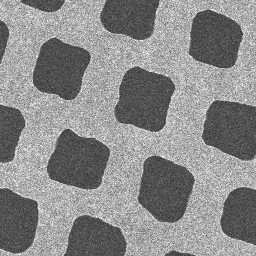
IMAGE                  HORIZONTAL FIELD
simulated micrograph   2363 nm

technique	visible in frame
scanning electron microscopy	holes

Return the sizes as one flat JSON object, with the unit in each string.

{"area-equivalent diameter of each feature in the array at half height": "543 nm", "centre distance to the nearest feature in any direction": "0.834 µm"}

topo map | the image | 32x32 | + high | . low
+++.....+++++.......++++++++++++
+++++++++++++.......+++++..+++++
+++++++++++++......+++++.....+++
.++++++++++++......+++++......++
.+++++++++++++++...+++++......++
.++++....+++++++++++++++......++
.++++......+++++++++++++......++
+++++......+++++++++++++......++
++++.......+++++..++++++++++.+++
++++......+++++......+++++++++++
++++......+++++.......++++++++++
+++++.....+++++.......++++++++++
++++++++.++++++......+++++++++++
..++++++++++++.......+++++......
...+++++++++++.......+++++......
...+++++++++++++.....+++++......
...+++++.++++++++++++++++.......
..+++++.....+++++++++++++.......
..+++++......++++++++++++++.....
..++++........+++++.+++++++++...
++++++.......+++++....++++++++++
++++++.......+++++......++++++++
+++++++......+++++......++++++++
++++++++++..+++++.......++++++.+
...++++++++++++++.......++++....
.....+++++++++++++.....+++++....
.....++++++++++++++....+++++....
.....++++....+++++++..++++++....
.....++++......+++++++++++++....
....+++++......+++++++++++++....
....++++........++++++++++++++++
+..+++++........+++++.++++++++++